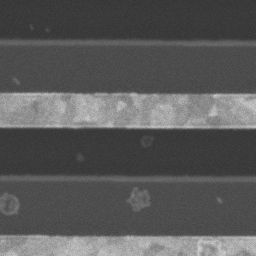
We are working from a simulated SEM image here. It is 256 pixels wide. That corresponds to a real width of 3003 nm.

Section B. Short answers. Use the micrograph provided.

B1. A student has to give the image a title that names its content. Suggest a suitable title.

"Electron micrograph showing lines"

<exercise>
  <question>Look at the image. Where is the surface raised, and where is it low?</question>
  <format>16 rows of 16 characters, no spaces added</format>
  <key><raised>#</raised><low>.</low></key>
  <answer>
................
................
................
################
################
################
################
################
................
................
................
################
################
################
################
################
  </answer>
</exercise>